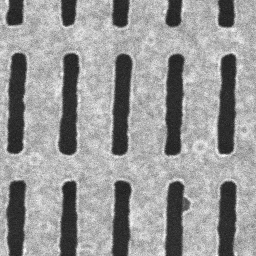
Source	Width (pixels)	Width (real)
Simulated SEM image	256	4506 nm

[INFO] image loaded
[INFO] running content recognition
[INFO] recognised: holes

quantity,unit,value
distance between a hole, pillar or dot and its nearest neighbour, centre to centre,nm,924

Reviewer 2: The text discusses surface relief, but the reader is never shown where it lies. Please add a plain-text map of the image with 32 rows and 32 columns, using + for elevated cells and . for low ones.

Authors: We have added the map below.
+..+++++..++++..+++++..++++..+++
+..+++++..++++..+++++..++++..+++
+..+++++.+++++..+++++..++++..+++
++++++++++++++++++++++++++++++++
++++++++++++++++++++++++++++++++
++++++++++++++++++++++++++++++++
++++++++++++++++++++++++++++++++
+..+++++..++++...++++..+++++..++
+..+++++..++++...++++..++++...++
+..+++++..++++..+++++..+++++..++
+..+++++..++++..+++++..+++++.+++
+..+++++..++++..+++++..++++..+++
+..+++++..++++..+++++..++++..+++
+..+++++..++++..+++++..++++..+++
+..+++++..++++..+++++..++++..+++
+..++++...++++..+++++..++++..+++
+..++++...++++..+++++..++++..+++
+..++++...++++..+++++..++++..+++
+..++++...++++..++++...++++..+++
++++++++++++++++++++++++++++++++
++++++++++++++++++++++++++++++++
++++++++++++++++++++++++++++++++
++++++++++++++++++++++++++++++++
+..+++++..++++..+++++..+++++..++
+..+++++..++++..+++++..++++...++
+..+++++..++++..+++++..++++...++
+..+++++..++++..+++++..++++...++
+..++++...++++..+++++..++++...++
+..++++...++++..+++++..++++...++
+..++++...++++..+++++..++++..+++
+..++++...++++..+++++..++++..+++
+..++++...++++..+++++..++++..+++